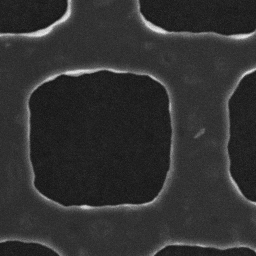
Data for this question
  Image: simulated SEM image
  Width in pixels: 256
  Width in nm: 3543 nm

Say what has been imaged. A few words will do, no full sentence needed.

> holes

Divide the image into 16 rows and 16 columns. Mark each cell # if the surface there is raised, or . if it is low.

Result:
....#####.......
...######.......
################
################
######.#########
##........#####.
##.........###..
##.........###..
##.........###..
##.........###..
##.........###..
##........#####.
###......#######
################
################
...#######...###